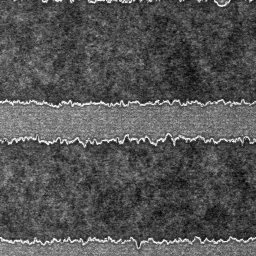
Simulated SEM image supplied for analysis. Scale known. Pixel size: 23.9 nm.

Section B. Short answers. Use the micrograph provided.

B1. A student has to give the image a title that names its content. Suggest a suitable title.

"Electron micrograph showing one or a few lines or trenches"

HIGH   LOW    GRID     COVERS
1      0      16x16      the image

0000000000000000
0000000000000000
0000000000000000
0000000000000000
0000000000000000
0000000000000000
1110111011111111
1111111111111111
1111111111111111
0000000000000000
0000000000000000
0000000000000000
0000000000000000
0000000000000000
0000000000000000
1111111111111111